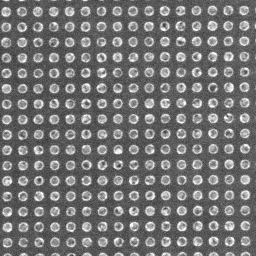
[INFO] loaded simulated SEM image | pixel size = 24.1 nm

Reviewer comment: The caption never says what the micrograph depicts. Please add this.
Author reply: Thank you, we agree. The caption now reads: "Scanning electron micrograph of a regular array of raised bodies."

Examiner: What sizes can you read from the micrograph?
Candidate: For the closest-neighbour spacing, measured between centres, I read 0.368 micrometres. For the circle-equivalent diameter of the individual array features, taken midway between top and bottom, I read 8.37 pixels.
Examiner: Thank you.